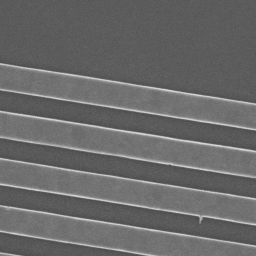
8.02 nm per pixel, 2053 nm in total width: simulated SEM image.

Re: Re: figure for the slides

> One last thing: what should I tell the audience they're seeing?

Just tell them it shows parallel lines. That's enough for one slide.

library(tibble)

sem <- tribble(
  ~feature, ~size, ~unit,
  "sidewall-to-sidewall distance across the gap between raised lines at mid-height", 167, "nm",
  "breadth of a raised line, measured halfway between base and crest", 205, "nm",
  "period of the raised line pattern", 0.376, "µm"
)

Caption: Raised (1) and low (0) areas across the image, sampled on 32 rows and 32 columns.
00000000000000000000000000000000
00000000000000000000000000000000
00000000000000000000000000000000
00000000000000000000000000000000
00000000000000000000000000000000
00000000000000000000000000000000
00000000000000000000000000000000
00000000000000000000000000000000
11100000000000000000000000000000
11111111110000000000000000000000
11111111111111110000000000000000
00111111111111111111110000000000
00000000011111111111111111110000
00000000000000011111111111111111
11110000000000000000011111111111
11111111110000000000000000001111
11111111111111110000000000000000
00111111111111111111110000000000
00000000011111111111111111111000
00000000000000011111111111111111
11110000000000000000011111111111
11111111110000000000000000001111
11111111111111111000000000000000
00011111111111111111111000000000
00000000011111111111111111111100
00000000000000001111111111111111
11111000000000000000001111111111
11111111111000000000000000001111
11111111111111111000000000000000
00001111111111111111111100000000
00000000001111111111111111111110
00000000000000001111111111111111